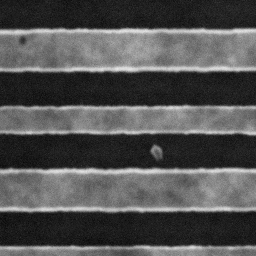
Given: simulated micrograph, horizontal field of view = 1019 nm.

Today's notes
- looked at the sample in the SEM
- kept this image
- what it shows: lines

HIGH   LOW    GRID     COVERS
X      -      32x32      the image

--------------------------------
--------------------------------
--------------------------------
--------------------------------
XXXXXXXXXXXXXXXXXXXXXXXXXXXXXXXX
XXXXXXXXXXXXXXXXXXXXXXXXXXXXXXXX
XXXXXXXXXXXXXXXXXXXXXXXXXXXXXXXX
XXXXXXXXXXXXXXXXXXXXXXXXXXXXXXXX
XXXXXXXXXXXXXXXXXXXXXXXXXXXXXXXX
--------------------------------
--------------------------------
--------------------------------
--------------------------------
XXXXXXXXXXXXXXXXXXXXXXXXXXXXXXXX
XXXXXXXXXXXXXXXXXXXXXXXXXXXXXXXX
XXXXXXXXXXXXXXXXXXXXXXXXXXXXXXXX
XXXXXXXXXXXXXXXXXXXXXXXXXXXXXXXX
--------------------------------
--------------------------------
--------------------------------
--------------------------------
XXXXXXXXXXXXXXXXXXXXXXXXXXXXXXXX
XXXXXXXXXXXXXXXXXXXXXXXXXXXXXXXX
XXXXXXXXXXXXXXXXXXXXXXXXXXXXXXXX
XXXXXXXXXXXXXXXXXXXXXXXXXXXXXXXX
XXXXXXXXXXXXXXXXXXXXXXXXXXXXXXXX
--------------------------------
--------------------------------
--------------------------------
--------------------------------
--------------------------------
XXXXXXXXXXXXXXXXXXXXXXXXXXXXXXXX